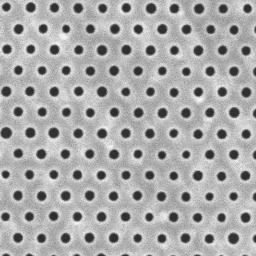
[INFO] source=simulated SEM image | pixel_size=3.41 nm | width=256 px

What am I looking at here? a regular array of holes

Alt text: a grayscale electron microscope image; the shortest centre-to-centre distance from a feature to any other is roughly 0.0803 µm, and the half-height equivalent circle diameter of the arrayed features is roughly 31.9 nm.